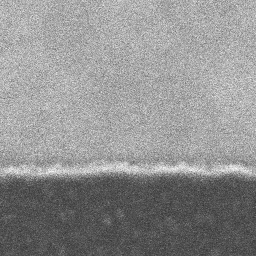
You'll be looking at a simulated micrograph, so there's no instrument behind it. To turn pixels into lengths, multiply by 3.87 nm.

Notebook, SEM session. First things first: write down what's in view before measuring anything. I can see one or a few lines or trenches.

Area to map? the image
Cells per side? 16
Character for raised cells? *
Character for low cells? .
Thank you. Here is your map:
................
................
................
................
................
................
................
................
................
................
......******..*.
****************
****************
****************
****************
****************